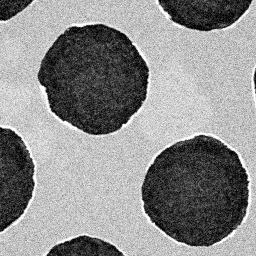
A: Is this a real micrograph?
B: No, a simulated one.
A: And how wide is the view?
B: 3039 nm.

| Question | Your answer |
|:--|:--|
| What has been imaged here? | holes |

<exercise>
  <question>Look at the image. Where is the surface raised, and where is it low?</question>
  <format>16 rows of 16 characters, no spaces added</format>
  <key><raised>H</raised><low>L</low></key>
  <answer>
LLHHHHHHHHLLLLLH
HHHHHHHHHHHLLLLH
HHHHLLLLHHHHHHHH
HHHLLLLLLHHHHHHH
HHLLLLLLLHHHHHHH
HHHLLLLLLHHHHHHH
HHHLLLLLLHHHHHHH
HHHHLLLLHHHHHHHH
LHHHHHHHHHHHLHHH
LLHHHHHHHHLLLLLH
LLHHHHHHHLLLLLLH
LLHHHHHHHLLLLLLL
LLHHHHHHHLLLLLLL
LHHHHHHHHLLLLLLH
HHHHHHHHHHLLLLLH
HHHLLLLHHHHHHHHH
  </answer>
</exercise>